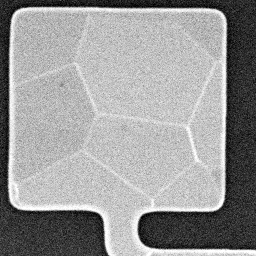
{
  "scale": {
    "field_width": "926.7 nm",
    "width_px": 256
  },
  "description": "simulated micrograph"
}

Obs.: wiring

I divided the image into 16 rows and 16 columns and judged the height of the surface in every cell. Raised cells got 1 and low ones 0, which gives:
0000000000000000
0111111111111100
0111111111111100
0111111111111100
0111111111111100
0111111111111100
0111111111111100
0111111111111100
0111111111111100
0111111111111100
0111111111111100
0111111111111100
0111111111111100
0000001110000000
0000000110000000
0000000110000000